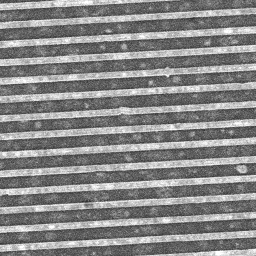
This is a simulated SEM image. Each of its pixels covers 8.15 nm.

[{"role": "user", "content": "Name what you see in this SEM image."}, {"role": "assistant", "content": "parallel lines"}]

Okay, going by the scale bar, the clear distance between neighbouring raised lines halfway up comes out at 104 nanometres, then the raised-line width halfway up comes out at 6.37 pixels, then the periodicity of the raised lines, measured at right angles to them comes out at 0.151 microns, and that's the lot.